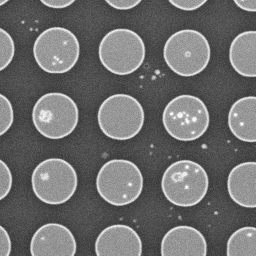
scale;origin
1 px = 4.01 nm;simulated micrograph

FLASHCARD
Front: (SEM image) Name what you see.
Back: an array of small figures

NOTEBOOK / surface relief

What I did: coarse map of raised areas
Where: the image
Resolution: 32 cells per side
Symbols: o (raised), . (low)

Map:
......ooo.....ooo.....ooo.....oo
................................
................................
.......o........................
o....oooo....oooo.....ooo.....oo
oo..oooooo...ooooo...ooooo...ooo
oo..oooooo..oooooo...ooooo...ooo
o....ooooo...ooooo...ooooo...ooo
.....oooo....oooo....ooooo...ooo
................................
................................
................................
o....oooo....oooo.....ooo.....oo
o...oooooo...ooooo...ooooo...ooo
oo..oooooo..oooooo..oooooo...ooo
o...oooooo..oooooo...ooooo...ooo
o....oooo....oooo....ooooo...ooo
.......................o......oo
................................
................................
o....oooo....oooo.....ooo.....oo
o...ooooo...oooooo...ooooo...ooo
o...oooooo..oooooo..oooooo..oooo
o...ooooo...oooooo..oooooo..oooo
o....oooo....oooo....oooo....ooo
..............oo......oo......oo
................................
................................
.....ooo.....ooo......oo......oo
o...ooooo...ooooo....oooo....ooo
o...ooooo...oooooo..oooooo..oooo
o...ooooo...oooooo..oooooo..oooo